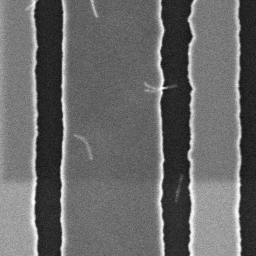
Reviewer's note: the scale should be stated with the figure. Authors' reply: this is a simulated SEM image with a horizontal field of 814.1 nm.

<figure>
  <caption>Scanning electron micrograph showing lines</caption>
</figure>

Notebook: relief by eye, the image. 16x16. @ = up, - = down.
@@--@@@@@@--@@@-
@@--@@@@@@--@@@-
@@--@@@@@@--@@@-
@@--@@@@@@--@@@-
@@--@@@@@@--@@@-
@@--@@@@@@--@@@-
@@--@@@@@@--@@@-
@@--@@@@@@--@@@-
@@--@@@@@@--@@@-
@@--@@@@@@--@@@-
@@--@@@@@@--@@@-
@@--@@@@@@--@@@-
@@--@@@@@@--@@@-
@@--@@@@@@--@@@-
@@--@@@@@@--@@@-
@@--@@@@@@--@@@-